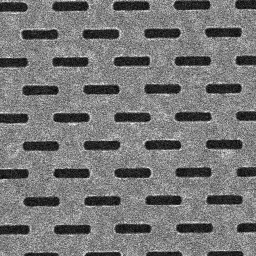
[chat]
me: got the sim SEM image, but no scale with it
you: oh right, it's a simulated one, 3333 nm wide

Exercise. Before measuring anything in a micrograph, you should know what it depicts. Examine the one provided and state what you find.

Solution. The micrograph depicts a regular array of holes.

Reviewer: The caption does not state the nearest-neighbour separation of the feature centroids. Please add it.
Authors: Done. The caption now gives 535 nanometers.